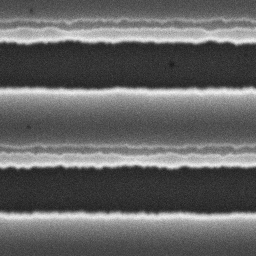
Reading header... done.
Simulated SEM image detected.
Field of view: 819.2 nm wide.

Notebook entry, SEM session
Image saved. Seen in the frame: lines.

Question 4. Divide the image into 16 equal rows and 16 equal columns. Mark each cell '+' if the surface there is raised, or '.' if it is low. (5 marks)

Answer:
++++++++++++++++
++++++++++++++++
++++.+++++++++++
................
................
................
++++++++++++++++
++++++++++++++++
++++++++++++++++
++++++++++++++++
................
................
................
..++++.+..++..++
++++++++++++++++
++++++++++++++++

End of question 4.